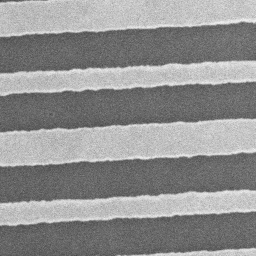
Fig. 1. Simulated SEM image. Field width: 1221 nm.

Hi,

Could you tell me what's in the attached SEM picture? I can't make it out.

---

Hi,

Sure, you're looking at lines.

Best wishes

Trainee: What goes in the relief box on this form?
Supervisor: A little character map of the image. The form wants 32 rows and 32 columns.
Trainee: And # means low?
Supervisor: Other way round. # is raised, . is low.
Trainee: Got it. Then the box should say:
################################
################################
################################
################..#.............
#...............................
................................
................................
................................
................################
################################
#######################.........
###.............................
................................
................................
................................
.....................###########
.###############################
################################
################################
########################........
######..........................
................................
................................
................................
.....................###########
.###############################
#############################...
#########.#.....................
................................
................................
................................
.........................#.#####